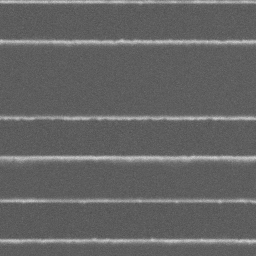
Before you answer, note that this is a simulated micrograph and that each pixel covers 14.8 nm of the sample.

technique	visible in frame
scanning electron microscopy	lines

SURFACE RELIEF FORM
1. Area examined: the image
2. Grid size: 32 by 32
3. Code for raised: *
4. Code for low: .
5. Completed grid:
................................
................................
................................
................................
................................
********************************
********************************
********************************
********************************
********************************
********************************
********************************
********************************
********************************
********************************
................................
................................
................................
................................
................................
********************************
********************************
********************************
********************************
********************************
................................
................................
................................
................................
................................
********************************
********************************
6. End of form